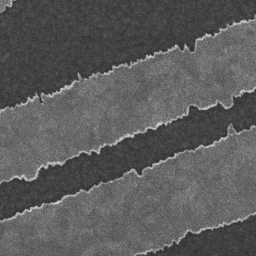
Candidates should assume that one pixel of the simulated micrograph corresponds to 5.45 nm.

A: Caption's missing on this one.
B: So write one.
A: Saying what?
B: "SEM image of one or a few lines or trenches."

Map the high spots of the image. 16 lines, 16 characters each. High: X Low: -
----------------
---------------X
------------XXXX
---------XXXXXXX
-------XXXXXXXXX
----XXXXXXXXXXXX
-XXXXXXXXXXXXX--
XXXXXXXXXXX-----
XXXXXXXX------XX
XXXXXX-----XXXXX
XXX------XXXXXXX
------XXXXXXXXXX
----XXXXXXXXXXXX
-XXXXXXXXXXXXXXX
XXXXXXXXXXXX----
XXXXXXXXXX------